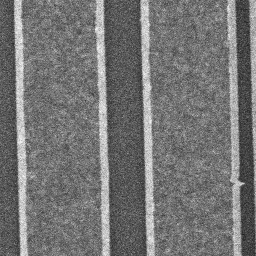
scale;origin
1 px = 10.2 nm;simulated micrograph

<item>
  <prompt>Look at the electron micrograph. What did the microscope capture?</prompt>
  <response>one or a few lines or trenches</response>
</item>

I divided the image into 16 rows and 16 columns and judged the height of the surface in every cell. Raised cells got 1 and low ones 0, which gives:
0111110001111100
0111110001111110
0111110001111100
0111110001111110
0111110001111110
0111110001111110
0111110001111110
0111110001111110
0111110001111110
0111110001111110
0111111001111110
0111111001111110
0111111001111110
0111111001111110
0111111001111110
0111111001111110